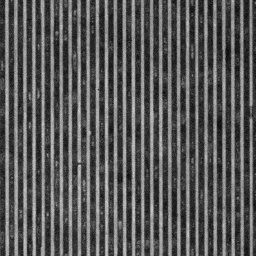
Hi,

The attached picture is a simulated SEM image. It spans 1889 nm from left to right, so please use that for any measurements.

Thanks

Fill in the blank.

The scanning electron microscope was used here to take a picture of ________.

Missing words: parallel lines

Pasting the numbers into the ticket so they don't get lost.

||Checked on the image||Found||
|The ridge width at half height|1.87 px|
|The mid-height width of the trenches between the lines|52.5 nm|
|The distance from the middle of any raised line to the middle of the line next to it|66.7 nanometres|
